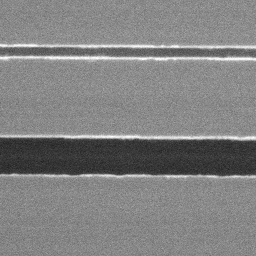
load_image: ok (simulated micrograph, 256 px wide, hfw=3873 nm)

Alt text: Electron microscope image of lines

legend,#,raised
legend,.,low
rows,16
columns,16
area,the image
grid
################
################
################
################
################
################
################
################
..#.############
................
................
################
################
################
################
################